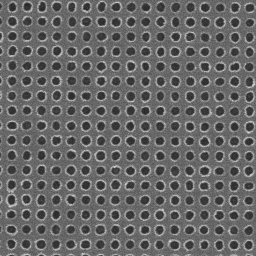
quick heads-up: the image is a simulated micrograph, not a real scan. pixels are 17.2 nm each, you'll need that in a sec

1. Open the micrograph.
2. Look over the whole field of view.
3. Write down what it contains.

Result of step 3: a regular array of holes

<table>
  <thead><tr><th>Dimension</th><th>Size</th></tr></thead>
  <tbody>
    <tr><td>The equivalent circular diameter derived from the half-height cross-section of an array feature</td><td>0.153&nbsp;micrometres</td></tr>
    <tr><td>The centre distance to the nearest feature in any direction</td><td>250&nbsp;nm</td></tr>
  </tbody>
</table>